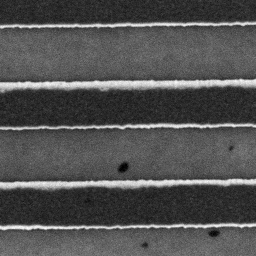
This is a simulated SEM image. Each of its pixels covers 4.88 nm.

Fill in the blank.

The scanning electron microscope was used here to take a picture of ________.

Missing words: lines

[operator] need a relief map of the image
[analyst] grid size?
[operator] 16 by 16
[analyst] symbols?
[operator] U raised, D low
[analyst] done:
UUUUUUUUUUUUUUUU
UUUUUUUUUUUUUUUU
DDDDDDDDDDDDDDDD
DDDDDDDDDDDDDDDD
DDDDDDDDDDDDDDDD
UUUUUUUUUUUUUUUU
UUUUUUUUUUUUUUUU
UUUUUUUUUUUUUUUU
DDDDDDDDDDDDDDDD
DDDDDDDDDDDDDDDD
DDDDDDDDDDDDDDDD
UUUUUUUUUUUUUUUU
UUUUUUUUUUUUUUUU
UUUUUUUUUUUUUUUU
DDDDDDDDDDDDDDDD
DDDDDDDDDDDDDDDD